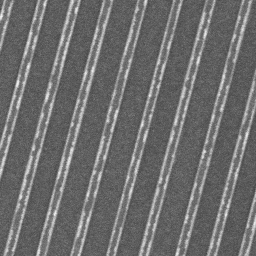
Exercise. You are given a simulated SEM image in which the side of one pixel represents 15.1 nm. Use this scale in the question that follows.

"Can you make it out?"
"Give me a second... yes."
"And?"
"parallel lines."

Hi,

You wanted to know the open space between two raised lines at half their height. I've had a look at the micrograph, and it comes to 356 nm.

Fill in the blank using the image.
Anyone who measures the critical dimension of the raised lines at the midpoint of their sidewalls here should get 128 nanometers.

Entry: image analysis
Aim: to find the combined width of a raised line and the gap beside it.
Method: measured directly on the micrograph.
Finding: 495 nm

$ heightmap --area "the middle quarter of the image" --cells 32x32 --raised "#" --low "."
......##......##.......##......#
.....###......##.......##......#
.....##.......##.......##......#
.....##......###......##......##
.....##......##.......##......##
....###......##.......##......##
....##.......##.......##......##
....##......###......##......###
....##......##.......##......##.
...##.......##.......##......##.
...##.......##.......#.......##.
...##......##.......##......##..
...##......##.......##......##..
..##.......##.......##......##..
..##.......##.......#.......##..
..##......##.......##......##...
.###......##.......##......##...
.##.......##.......##......##...
.##......###......##.......##...
.##......##.......##......##....
###......##.......##......##....
##.......##.......##......##....
##......###......##......###....
##......##.......##......##.....
##......##.......##......##.....
#.......##.......##......##.....
#......###......##......###.....
#......##.......##......##......
.......##.......##......##......
.......##.......#.......##......
......##.......##......##.......
......##.......##......##.......